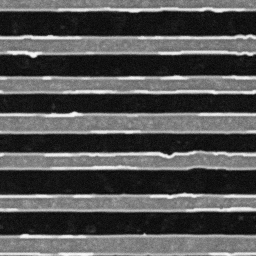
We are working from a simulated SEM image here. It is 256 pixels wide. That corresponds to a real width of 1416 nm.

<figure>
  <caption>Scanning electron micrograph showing parallel lines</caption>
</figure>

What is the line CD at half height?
0.0926 micrometres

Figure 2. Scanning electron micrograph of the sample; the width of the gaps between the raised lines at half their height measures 131 nm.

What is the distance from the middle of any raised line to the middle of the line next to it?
39.6 px